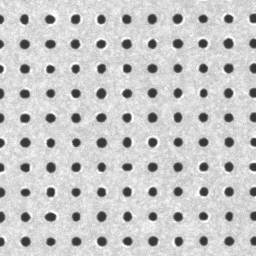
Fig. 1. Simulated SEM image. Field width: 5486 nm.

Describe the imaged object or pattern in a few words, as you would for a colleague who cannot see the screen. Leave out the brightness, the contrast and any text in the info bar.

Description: a regular array of holes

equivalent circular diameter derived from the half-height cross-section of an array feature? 219 nanometres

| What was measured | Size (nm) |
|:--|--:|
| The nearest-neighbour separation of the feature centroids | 526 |